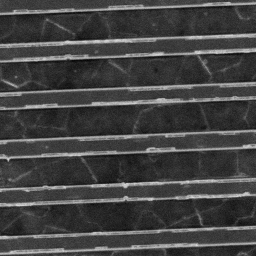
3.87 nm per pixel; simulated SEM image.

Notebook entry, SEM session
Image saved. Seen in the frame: parallel lines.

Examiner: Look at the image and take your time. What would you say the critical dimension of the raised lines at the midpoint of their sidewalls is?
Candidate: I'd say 16.9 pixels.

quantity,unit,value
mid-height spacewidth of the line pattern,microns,0.119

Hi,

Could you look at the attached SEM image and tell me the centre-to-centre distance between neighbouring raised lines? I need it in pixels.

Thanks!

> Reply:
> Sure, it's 48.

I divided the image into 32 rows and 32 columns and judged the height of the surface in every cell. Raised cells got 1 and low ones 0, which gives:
11111111111111111111111111111100
11111100000000000000000000000000
00000000000000000000000000000000
00000000000000000000000000000000
00000000000000000000000000111111
00000111111111111111111111111111
11111111111111111111111111111110
11111000000000000000000000000000
00000000000000000000000000000000
00000000000000000000000000000000
00000000000000000000000000001111
00001111111111111111111111111111
11111111111111111111111111110000
11110000000000000000000000000000
00000000000000000000000000000000
00000000000000000000000000000000
00000000000000000000000000010011
00011111111111111111111111111111
11111111111111111111111111111100
11111100000000000000000000000000
00000000000000000000000000000000
00000000000000000000000000000000
00000000000000000000000000100111
00000111111111111111111111111111
11111111111111111111111111111110
11111000000000000000000000000000
00000000000000000000000000000000
00000000000000000000000000000000
00000000000000000000000000001111
00001111111111111111111111111111
11111111111111111111111111110000
11110010000000000000000000000000